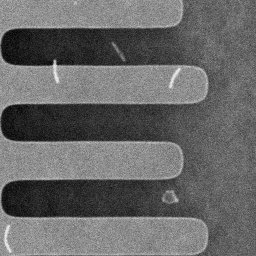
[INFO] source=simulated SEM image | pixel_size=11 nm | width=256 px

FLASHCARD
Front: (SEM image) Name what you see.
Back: groups of lines, slits or small figures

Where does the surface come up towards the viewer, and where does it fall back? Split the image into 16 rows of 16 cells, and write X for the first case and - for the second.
XXXXXXXXXXX-----
XXXXXXXXXXX-----
----------------
----------------
XXXXXXXXXXXXX---
XXXXXXXXXXXXX---
X---------------
----------------
----------------
XXXXXXXXXXX-----
XXXXXXXXXXX-----
X---------------
----------------
X---------------
XXXXXXXXXXXXX---
XXXXXXXXXXXXX---